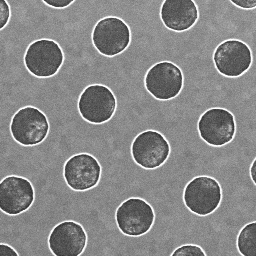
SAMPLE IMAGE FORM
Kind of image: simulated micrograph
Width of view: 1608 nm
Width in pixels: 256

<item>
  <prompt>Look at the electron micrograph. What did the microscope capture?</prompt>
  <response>a regular array of holes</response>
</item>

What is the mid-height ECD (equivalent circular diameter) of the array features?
234 nm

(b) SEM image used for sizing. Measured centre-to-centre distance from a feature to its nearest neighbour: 435 nanometres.